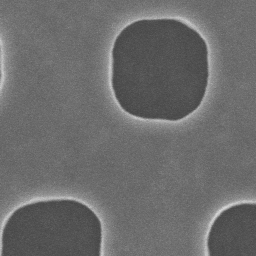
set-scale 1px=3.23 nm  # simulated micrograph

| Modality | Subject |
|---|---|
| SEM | holes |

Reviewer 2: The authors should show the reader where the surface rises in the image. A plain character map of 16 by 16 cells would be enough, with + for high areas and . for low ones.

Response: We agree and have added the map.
++++++++++++++++
++++++++....++++
+++++++......+++
+++++++......+++
+++++++......+++
+++++++......+++
+++++++.....++++
++++++++++.+++++
++++++++++++++++
++++++++++++++++
++++++++++++++++
++++++++++++++++
+++..+++++++++++
+.....++++++++..
......+++++++...
......+++++++...